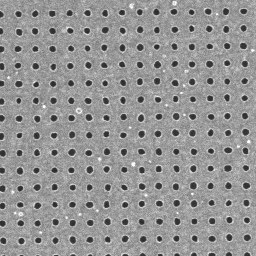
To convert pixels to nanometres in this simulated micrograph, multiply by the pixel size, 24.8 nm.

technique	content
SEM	a regular array of holes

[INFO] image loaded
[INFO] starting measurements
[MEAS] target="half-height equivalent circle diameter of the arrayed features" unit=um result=0.163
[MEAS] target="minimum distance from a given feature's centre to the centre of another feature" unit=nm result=417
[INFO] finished